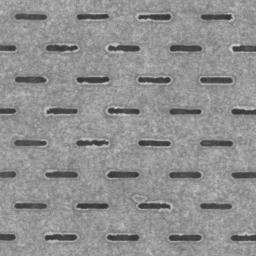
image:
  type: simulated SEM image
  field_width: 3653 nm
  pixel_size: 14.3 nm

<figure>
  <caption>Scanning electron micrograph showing a regular array of holes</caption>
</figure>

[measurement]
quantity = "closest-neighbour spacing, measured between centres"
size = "0.624 microns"